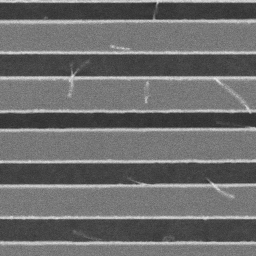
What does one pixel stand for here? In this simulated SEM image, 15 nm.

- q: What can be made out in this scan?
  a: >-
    lines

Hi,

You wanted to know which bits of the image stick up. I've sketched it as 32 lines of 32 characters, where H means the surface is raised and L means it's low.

LLLLLLLLLLLLLLLLLLLLLLLLLLLLLLLL
LLLLLLLLLLLLLLLLLLLLLLLLLLLLLLLL
LLLLLLLLLLLLLLLLLLLHLLLLLLLLLLLH
HHHHHHHHHHHHHHHHHHHHHHHHHHHHHHHH
HHHHHHHHHHHHHHHHHHHHHHHHHHHHHHHH
HHHHHHHHHHHHHHHHHHHHHHHHHHHHHHHH
HHHHHHHHHHHHHHHHHHHHHHHHHHHHHHHH
LLLLLLLLLLLLLLLLLLLLLLLLLLLLLLLL
LLLLLLLLLLLLLLLLLLLLLLLLLLLLLLLL
LLLLLLLLHHLLLLLLLLLLLLLLLLLLLLLL
HHHHHHHHHHHHHHHHHHHHHHHHHHHHHHHH
HHHHHHHHHHHHHHHHHHHHHHHHHHHHHHHH
HHHHHHHHHHHHHHHHHHHHHHHHHHHHHHHH
HHHHHHHHHHHHHHHHHHHHHHHHHHHHHHHH
LLLLLLLLLLLLLLLLLLLLLLLLLLLLLLLL
LLLLLLLLLLLLLLLLLLLLLLLLLLLLLLLL
HHHHHHHHHHHHHHHHHHHHHHHHHHHHHHHH
HHHHHHHHHHHHHHHHHHHHHHHHHHHHHHHH
HHHHHHHHHHHHHHHHHHHHHHHHHHHHHHHH
HHHHHHHHHHHHHHHHHHHHHHHHHHHHHHHH
LLLLLLLLLLLLLLLLLLLLLLLLLLLLLLLL
LLLLLLLLLLLLLLLLLLLLLLLLLLLLLLLL
LLLLLLLLLLLLLLLLLLLLLLLLLLLLLLLL
HHHHHHHHHHHHHHHHHHHHHHHHHHHHHHHH
HHHHHHHHHHHHHHHHHHHHHHHHHHHHHHHH
HHHHHHHHHHHHHHHHHHHHHHHHHHHHHHHH
HHHHHHHHHHHHHHHHHHHHHHHHHHHHHHHH
LLLLLLLLLLLLLLLLLLLLLLLLLLLLLLLL
LLLLLLLLLLLLLLLLLLLLLLLLLLLLLLLL
LLLLLLLLLLLLLLLLLLLLLLLLLLLLLLLL
HHHHHHHHHHHHHHHHHHHHHHHHHHHHHHHH
HHHHHHHHHHHHHHHHHHHHHHHHHHHHHHHH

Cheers